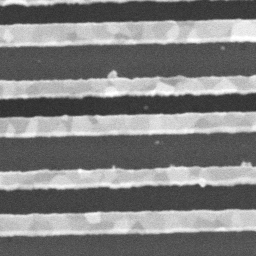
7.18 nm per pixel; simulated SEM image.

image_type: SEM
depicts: lines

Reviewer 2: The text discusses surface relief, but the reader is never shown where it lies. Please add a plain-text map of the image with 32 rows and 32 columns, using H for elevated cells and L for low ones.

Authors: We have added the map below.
HLHHHHHLLLLLLLLLLLLLLLLLLLLLLLLL
LLLLLLLLLLLLLLLLLLLLLLLLLLLLLLLL
LLLLLLLLLLLLLLLLLLLLLLLLLLLLLHLL
HHHHHHHHHHHHHHHHHHHHHHHHHHHHHHHH
HHHHHHHHHHHHHHHHHHHHHHHHHHHHHHHH
HHHHHHHHHHHLLLLLLLLLLLLLLLLLLLLL
LLLLLLLLLLLLLLLLLLLLLLLLLLLLLLLL
LLLLLLLLLLLLLLLLLLLLLLLLLLLLLLLL
LLLLLLLLLLLLLLLLLLLLLLLLLLLLLLLL
LLLLLLLLLLLLLLLLLLLLLLLLLLLLLLLL
HHHHHHHHHHHHHHHHHHHHHHHHHHHHHHHH
HHHHHHHHHHHHHHHHHHHHHHHHHHHHHHHH
LLLLLLLLLLLLLLLLLLLLLLLLLLLLLLLL
LLLLLLLLLLLLLLLLLLLLLLLLLLLLLLLL
LLLLLLLLHLHHHHHHHHHHHHHHHHHHHHHH
HHHHHHHHHHHHHHHHHHHHHHHHHHHHHHHH
HHHHHHHHHHHHHHHHHHHHHHHHLHLLLLLL
LLLLLLLLLLLLLLLLLLLLLLLLLLLLLLLL
LLLLLLLLLLLLLLLLLLLLLLLLLLLLLLLL
LLLLLLLLLLLLLLLLLLLLLLLLLLLLLLLL
LLLLLLLLLLLLLLLLLLLLLLLLLLLLLLLL
LLLLHHHHHHHHHHHHHHHHHHHHHHHHHHHH
HHHHHHHHHHHHHHHHHHHHHHHHHHHHHHHH
HHHHLHLHHHLLLLLLLLLLLLLLLLLLLLLL
LLLLLLLLLLLLLLLLLLLLLLLLLLLLLLLL
LLLLLLLLLLLLLLLLLLLLLLLLLLLLLLLL
LLLLLLLLLLLLLLLLLLHHHHHHHHHHHHHH
HHHHHHHHHHHHHHHHHHHHHHHHHHHHHHHH
HHHHHHHHHHHHHHHHHHHHHHHHHHHHHHHH
LLLLLLLLLLLLLLLLLLLLLLLLLLLLLLLL
LLLLLLLLLLLLLLLLLLLLLLLLLLLLLLLL
LLLLLLLLLLLLLLLLLLLLLLLLLLLLLLLL